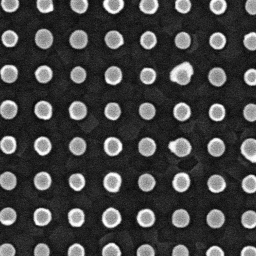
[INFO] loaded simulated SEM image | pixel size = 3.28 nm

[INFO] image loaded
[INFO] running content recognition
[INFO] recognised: a regular array of raised bodies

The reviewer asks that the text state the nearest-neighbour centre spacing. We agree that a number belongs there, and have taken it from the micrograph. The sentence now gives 0.113 um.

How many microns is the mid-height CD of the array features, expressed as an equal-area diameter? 0.0585